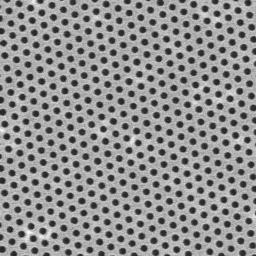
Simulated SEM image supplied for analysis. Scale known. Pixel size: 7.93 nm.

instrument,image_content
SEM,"a regular array of holes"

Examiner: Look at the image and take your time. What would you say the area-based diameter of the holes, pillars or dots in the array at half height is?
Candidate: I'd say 55.9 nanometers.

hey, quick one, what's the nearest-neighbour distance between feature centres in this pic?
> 95.9 nm